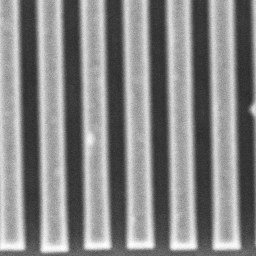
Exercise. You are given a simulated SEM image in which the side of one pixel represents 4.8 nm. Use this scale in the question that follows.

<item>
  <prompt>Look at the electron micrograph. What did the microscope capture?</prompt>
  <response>parallel lines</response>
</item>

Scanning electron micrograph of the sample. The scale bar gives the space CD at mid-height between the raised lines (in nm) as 101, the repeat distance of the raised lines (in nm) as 206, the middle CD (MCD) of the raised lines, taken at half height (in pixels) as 22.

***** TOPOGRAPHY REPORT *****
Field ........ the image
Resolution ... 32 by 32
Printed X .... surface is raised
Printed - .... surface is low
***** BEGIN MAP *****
XX---XXX--XXX---XX---XXX--XXX---
XX---XXX--XXX---XX---XXX--XXX---
XX---XXX--XXX---XX---XXX--XXX---
XX---XXX--XXX---XX---XXX--XXX---
XX---XXX--XXX---XX---XXX--XXX---
XX---XXX--XXX---XX---XXX--XXX---
XX---XXX--XXX---XX---XXX--XXX---
XX---XXX--XXX---XX---XXX--XXX---
XX---XXX--XXX---XX---XXX--XXX---
XX---XXX--XXX---XX---XXX--XXX---
XX---XXX--XXX---XXX--XXX---XX---
XX---XXX--XXX---XX---XXX---XX---
XX---XXX--XXX---XXX--XXX---XX---
XX---XXX---XX---XXX--XXX---XX---
XX---XXX---XX---XXX--XXX---XX---
XX---XXX---XX---XXX--XXX---XX---
XX---XXX---XX---XXX--XXX---XX---
XX---XXX---XX---XXX--XXX---XX---
XXX--XXX---XX---XXX--XXX---XX---
XXX--XXX---XX---XXX--XXX---XX---
XXX--XXX---XX---XXX--XXX---XX---
XXX--XXX---XX---XXX--XXX---XX---
XXX--XXX---XX---XXX--XXX---XXX--
XXX--XXX---XX---XXX--XXX---XXX--
XXX--XXX---XX---XXX---XX---XXX--
XXX--XXX---XX---XXX---XX---XXX--
XXX--XXX---XX---XXX---XX---XXX--
XXX--XXX---XX---XXX---XX---XXX--
XXX--XXX---XX---XXX---XX---XXX--
XXX--XXX---XX---XXX---XX---XXX--
XXX--XXX---XX---XXX---XX---XXX--
--------------------------------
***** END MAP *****